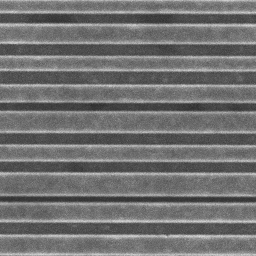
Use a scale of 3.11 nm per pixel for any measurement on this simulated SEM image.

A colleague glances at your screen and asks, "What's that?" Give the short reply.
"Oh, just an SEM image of parallel lines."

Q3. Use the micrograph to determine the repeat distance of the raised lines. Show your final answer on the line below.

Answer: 30.2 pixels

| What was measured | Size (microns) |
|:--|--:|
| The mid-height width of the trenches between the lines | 0.0377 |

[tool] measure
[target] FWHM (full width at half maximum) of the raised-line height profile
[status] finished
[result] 18.5 px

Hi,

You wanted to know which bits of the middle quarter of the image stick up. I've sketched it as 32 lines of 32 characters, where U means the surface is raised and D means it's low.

UUUUUUUUUUUUUUUUUUUUUUUUUUUUUUUU
UUUUUUUUUUUUUUUUUUUUUUUUUUUUUUUU
DDDDDDDDDDDDDDDDDDDDDDDDDDDDDDDD
DDDDDDDDDDDDDDDDDDDDDDDDDDDDDDDD
DDDDDDDDDDDDDDDDDDDDDDDDDDDDDDDD
UUUDDUDUUUUUDDDDDUUDDDDUDUUUUUDD
UUUUUUUUUUUUUUUUUUUUUUUUUUUUUUUU
UUUUUUUUUUUUUUUUUUUUUUUUUUUUUUUU
UUUUUUUUUUUUUUUUUUUUUUUUUUUUUUUU
DDDDDDDDDDDDDDDDDDDDDDDDDDDDDDDD
DDDDDDDDDDDDDDDDDDDDDDDDDDDDDDDD
DDDDDDDDDDDDDDDDDDDDDDDDDDDDDDDD
UUUUUUUUUUUUUUUUUUUUUUUUUUUUUUUU
UUUUUUUUUUUUUUUUUUUUUUUUUUUUUUUU
UUUUUUUUUUUUUUUUUUUUUUUUUUUUUUUU
UUUUUUUUUUUUUUUUUUUUUUUUUUUUUUUU
UUUUUUUUUUUUUUUUUUUUUUUUUUUUUUUU
DDDDDDDDDDDDDDDDDDDDDDDDDDDDDDDD
DDDDDDDDDDDDDDDDDDDDDDDDDDDDDDDD
DDDDDDDDDDDDDDDDDDDDDDDDDDDDDDDD
DDDDDDDDDDDDDDDDDDDDDDDDDDDDDDDD
UUUUUUUUUUUUUUUUUUUUUUUUUUUUUUUU
UUUUUUUUUUUUUUUUUUUUUUUUUUUUUUUU
UUUUUUUUUUUUUUUUUUUUUUUUUUUUUUUU
DDDDDDDDDDDDDDDDDDDDDDDDDDDDDDDD
DDDDDDDDDDDDDDDDDDDDDDDDDDDDDDDD
DDDDDDDDDDDDDDDDDDDDDDDDDDDDDDDD
UUUUUUUUUUUUUUUUUUUUDDDDDDDDDDDD
UUUUUUUUUUUUUUUUUUUUUUUUUUUUUUUU
UUUUUUUUUUUUUUUUUUUUUUUUUUUUUUUU
UUUUUUUUUUUUUUUUUUUUUUUUUUUUUUUU
UUUUUUUUUUUUUUUUUUUUUUUUUUUUUUUU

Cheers